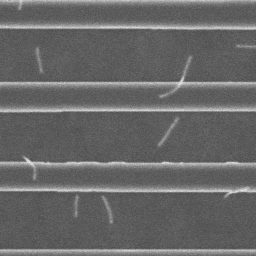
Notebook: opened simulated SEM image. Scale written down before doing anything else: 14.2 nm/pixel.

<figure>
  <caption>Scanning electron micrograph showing lines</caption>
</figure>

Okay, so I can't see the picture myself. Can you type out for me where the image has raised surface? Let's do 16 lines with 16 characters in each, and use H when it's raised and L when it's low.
HHHHHHHHHHHHHHHH
HHHHHHHHHHHHHHHH
LLLLLLLLLLLLLLLL
LLLLLLLLLLLLLLLL
LLLLLLLLLLLLLLLL
HHHHHHHHHHHHHHHH
HHHHHHHHHHHHHHHH
LLLLLLLLLLLLLLLL
LLLLLLLLLLLLLLLL
LLLLLLLLLLLLLLLL
HHHHHHHHHHHHHHHH
HHHHHHHHHHHHHHHH
LLLLLLLLLLLLLLLL
LLLLLLLLLLLLLLLL
LLLLLLLLLLLLLLLL
LLLLLLLLLLLLLLLL